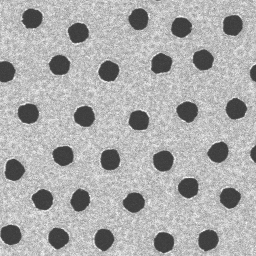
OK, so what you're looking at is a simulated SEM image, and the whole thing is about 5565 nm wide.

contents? a regular array of holes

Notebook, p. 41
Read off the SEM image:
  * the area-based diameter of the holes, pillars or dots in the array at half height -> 460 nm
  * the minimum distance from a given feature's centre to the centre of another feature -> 967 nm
